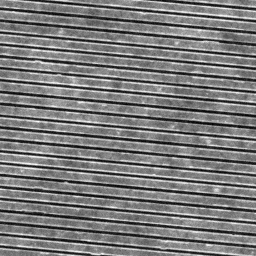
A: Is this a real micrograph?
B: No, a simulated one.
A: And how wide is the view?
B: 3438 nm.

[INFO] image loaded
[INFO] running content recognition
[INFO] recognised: parallel lines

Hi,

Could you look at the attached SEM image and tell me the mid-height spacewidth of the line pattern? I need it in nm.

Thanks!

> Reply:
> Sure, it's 50.1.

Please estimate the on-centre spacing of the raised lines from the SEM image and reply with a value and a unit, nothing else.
159 nm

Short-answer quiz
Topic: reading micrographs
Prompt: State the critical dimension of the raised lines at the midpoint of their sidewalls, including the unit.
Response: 112 nanometres